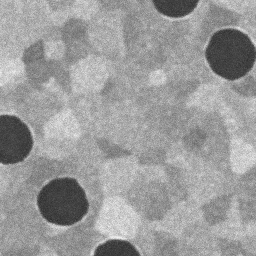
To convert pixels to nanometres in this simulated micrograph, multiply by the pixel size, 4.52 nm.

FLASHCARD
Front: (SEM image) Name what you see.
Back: holes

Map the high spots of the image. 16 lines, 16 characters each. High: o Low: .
oooooooooo..oooo
oooooooooooooooo
ooooooooooooo...
ooooooooooooo...
ooooooooooooo...
oooooooooooooooo
oooooooooooooooo
.ooooooooooooooo
..oooooooooooooo
..oooooooooooooo
oooooooooooooooo
ooo..ooooooooooo
oo...ooooooooooo
ooo..ooooooooooo
oooooooooooooooo
oooooo...ooooooo